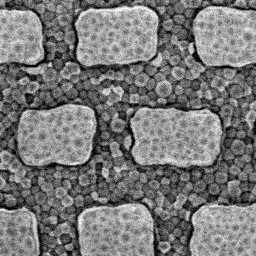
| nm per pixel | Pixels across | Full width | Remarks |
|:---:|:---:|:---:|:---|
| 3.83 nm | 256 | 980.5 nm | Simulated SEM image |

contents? raised bodies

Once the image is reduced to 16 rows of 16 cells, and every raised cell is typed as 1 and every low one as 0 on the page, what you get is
0000000010000000
1110011111001111
1110011111001111
1110011110001111
0000000000000000
0000000000000000
0000000000000000
0111110011111100
0111110011111100
0111110011111100
0000000000000000
0000000000000000
0000000000000000
1100011110001111
1100011111001111
1100011111001111